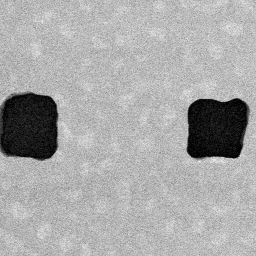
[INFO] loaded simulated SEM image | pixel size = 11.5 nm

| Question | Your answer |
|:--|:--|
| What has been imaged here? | holes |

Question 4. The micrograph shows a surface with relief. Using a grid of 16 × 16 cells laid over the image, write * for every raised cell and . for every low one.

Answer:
****************
****************
****************
****************
****************
****************
...*********...*
....********...*
....********...*
...*********...*
****************
****************
****************
****************
****************
****************